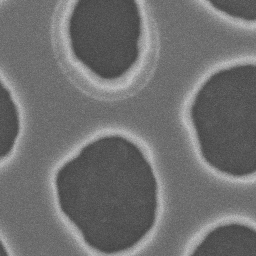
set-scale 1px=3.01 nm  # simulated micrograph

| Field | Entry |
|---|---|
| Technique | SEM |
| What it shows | holes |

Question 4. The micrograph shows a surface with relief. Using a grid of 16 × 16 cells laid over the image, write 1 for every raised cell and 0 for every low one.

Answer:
1111100001111000
1111000001111111
1111000001111111
1111100001111111
1111110011111000
1111111111110000
0111111111110000
0111111111110000
0111110011110000
0111100001110000
1111000001111000
1110000000111111
1111000000111111
1111000000111111
1111100001111000
1111110011110000